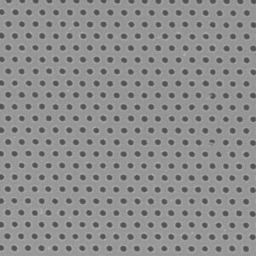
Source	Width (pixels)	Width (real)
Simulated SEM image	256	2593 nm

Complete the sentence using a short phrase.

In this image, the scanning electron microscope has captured a regular array of holes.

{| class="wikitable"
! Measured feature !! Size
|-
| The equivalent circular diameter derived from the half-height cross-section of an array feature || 58.3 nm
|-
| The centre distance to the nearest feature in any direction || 134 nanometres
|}